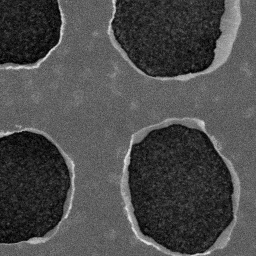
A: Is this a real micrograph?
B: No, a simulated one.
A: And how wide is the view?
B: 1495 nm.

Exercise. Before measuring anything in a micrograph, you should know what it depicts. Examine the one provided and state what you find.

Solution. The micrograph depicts holes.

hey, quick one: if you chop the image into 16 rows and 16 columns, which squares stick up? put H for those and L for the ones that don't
LLLLHHHLLLLLLLLH
LLLLHHHLLLLLLLHH
LLLLHHHLLLLLLLHH
LLLHHHHHLLLLLHHH
HHHHHHHHHLLLHHHH
HHHHHHHHHHHHHHHH
HHHHHHHHHHHHHHHH
HHHHHHHHHHHHHHHH
LLLHHHHHHLLLLHHH
LLLLHHHHLLLLLLHH
LLLLHHHHLLLLLLHH
LLLLLHHHLLLLLLLH
LLLLHHHHLLLLLLLH
LLLLHHHHLLLLLLLH
LLLHHHHHHLLLLLHH
HHHHHHHHHHLLLHHH